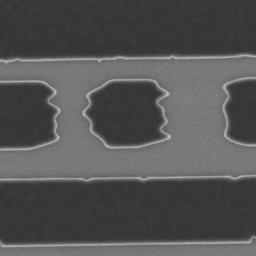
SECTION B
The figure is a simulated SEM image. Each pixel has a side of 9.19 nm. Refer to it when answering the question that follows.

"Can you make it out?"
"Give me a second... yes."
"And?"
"one or a few lines or trenches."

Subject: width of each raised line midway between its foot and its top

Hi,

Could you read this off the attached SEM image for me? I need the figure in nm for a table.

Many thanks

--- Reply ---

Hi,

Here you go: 616